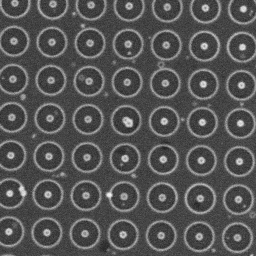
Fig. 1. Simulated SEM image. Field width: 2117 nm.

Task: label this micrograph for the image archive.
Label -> an array of small figures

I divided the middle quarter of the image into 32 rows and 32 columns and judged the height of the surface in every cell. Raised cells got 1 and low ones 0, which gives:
11111111111111111111111111111111
11110000111111000111111100111111
11100000011110000001111000001111
11100000001100000001110000001111
11100010001100010001110001000110
11100000011100000001110000000110
11110000011110000001110000001111
11111000111111000011111000011111
11111111111111111111111111111111
11111111111111111111111111111111
11111001111111111111111111111111
11110000011110000011111000011111
11100000011100000001110000001111
11000110011100010001110000001110
11100000011100011001100011000110
11100000011100001001110000001110
11110000111110000011110000001111
11111111111111101111111100011111
11111111111111111111111111111111
11111111111111111111111111111111
11110000111111000111111101111111
11100000011110000011110000011111
11000000011100000001110000001110
11000100011100010001100010001110
11000000011100000001100000001110
11100000111100000011110000001110
11110001111110000111110000011111
11111111111111111111111111111111
11111111111111111111111111111111
11111011111111111111111111111111
11100000111110000111111000011111
11000000011100000011110000001110